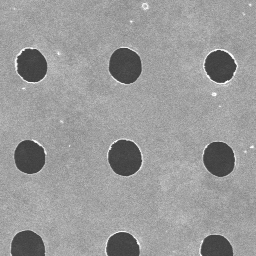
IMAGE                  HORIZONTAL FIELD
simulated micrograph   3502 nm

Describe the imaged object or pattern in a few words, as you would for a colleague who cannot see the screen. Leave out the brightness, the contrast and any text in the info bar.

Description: holes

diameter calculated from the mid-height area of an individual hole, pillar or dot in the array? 453 nanometers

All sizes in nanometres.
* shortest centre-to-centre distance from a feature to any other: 1260